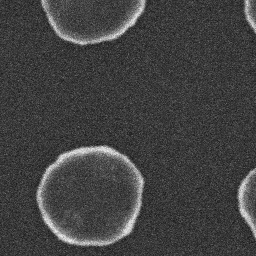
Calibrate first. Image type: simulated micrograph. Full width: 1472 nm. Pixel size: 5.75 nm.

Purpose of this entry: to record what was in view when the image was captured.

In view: raised bodies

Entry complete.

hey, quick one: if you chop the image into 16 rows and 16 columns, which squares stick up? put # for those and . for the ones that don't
...######......#
...#####........
....##..........
................
................
................
................
................
................
.....##.........
...#####........
...######......#
..#######......#
...#####.......#
...#####........
................